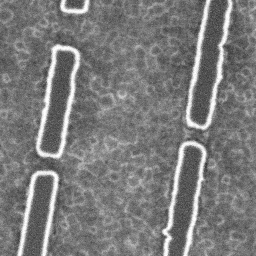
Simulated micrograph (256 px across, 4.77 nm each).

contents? one or a few lines or trenches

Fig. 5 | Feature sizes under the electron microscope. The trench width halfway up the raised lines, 0.563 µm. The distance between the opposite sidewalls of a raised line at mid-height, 115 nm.